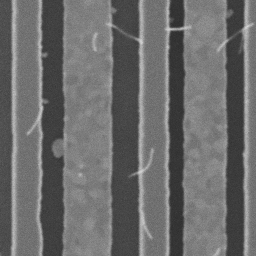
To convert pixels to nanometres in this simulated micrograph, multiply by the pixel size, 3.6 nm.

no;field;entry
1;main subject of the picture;lines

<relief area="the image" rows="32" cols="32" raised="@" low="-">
--@@@---@@@@@@---@@@@--@@@@@---@
--@@@---@@@@@@---@@@@--@@@@@---@
--@@@---@@@@@@---@@@@--@@@@@---@
--@@@---@@@@@@---@@@@--@@@@@--@@
--@@@---@@@@@@---@@@@--@@@@@--@@
--@@@---@@@@@@---@@@@--@@@@@--@@
--@@@---@@@@@@---@@@@--@@@@@--@@
--@@@---@@@@@@---@@@@--@@@@@---@
--@@@---@@@@@@---@@@@--@@@@@---@
--@@@---@@@@@@---@@@@--@@@@@---@
--@@@---@@@@@@---@@@@--@@@@@---@
--@@@---@@@@@@---@@@@--@@@@@---@
--@@@---@@@@@@---@@@@--@@@@@---@
--@@@---@@@@@@---@@@@--@@@@@---@
--@@@---@@@@@@---@@@@--@@@@@---@
--@@@---@@@@@@---@@@@--@@@@@---@
--@@@---@@@@@@---@@@@--@@@@@---@
--@@@---@@@@@@---@@@@--@@@@@---@
--@@@---@@@@@@---@@@@--@@@@@---@
--@@@---@@@@@@---@@@@--@@@@@--@@
--@@@---@@@@@@---@@@@--@@@@@--@@
--@@@---@@@@@@---@@@@--@@@@@---@
--@@@---@@@@@@---@@@@--@@@@@--@@
--@@@---@@@@@@---@@@@--@@@@@--@@
--@@@---@@@@@@---@@@@--@@@@@---@
--@@@---@@@@@@---@@@@--@@@@@---@
--@@@---@@@@@@---@@@@--@@@@@---@
--@@@---@@@@@@---@@@@--@@@@@---@
--@@@---@@@@@@---@@@@--@@@@@---@
--@@@---@@@@@@---@@@@--@@@@@---@
--@@@---@@@@@@---@@@@--@@@@@---@
-@@@@---@@@@@@---@@@@--@@@@@--@@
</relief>